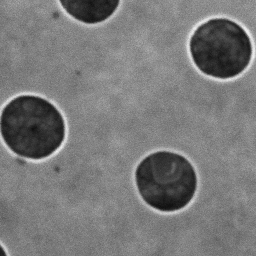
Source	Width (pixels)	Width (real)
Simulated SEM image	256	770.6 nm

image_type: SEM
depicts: holes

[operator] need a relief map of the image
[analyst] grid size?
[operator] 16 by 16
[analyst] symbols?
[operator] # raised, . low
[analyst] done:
####...#########
#############..#
############....
############....
#############..#
################
#..#############
....############
....############
#..#############
#########...####
#########...####
#########...####
################
################
################